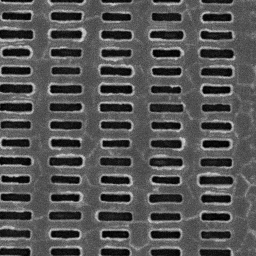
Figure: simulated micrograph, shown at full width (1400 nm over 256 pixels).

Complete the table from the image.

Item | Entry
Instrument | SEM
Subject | a regular array of holes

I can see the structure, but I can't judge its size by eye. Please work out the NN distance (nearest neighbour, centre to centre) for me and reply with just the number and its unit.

18.1 px